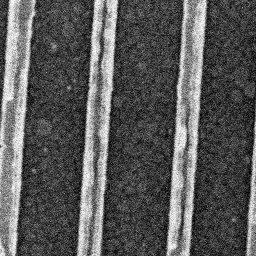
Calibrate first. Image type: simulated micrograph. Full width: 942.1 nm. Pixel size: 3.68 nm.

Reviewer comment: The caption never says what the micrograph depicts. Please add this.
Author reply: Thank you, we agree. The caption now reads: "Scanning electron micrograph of one or a few lines or trenches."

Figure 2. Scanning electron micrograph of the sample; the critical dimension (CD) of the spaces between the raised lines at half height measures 237 nm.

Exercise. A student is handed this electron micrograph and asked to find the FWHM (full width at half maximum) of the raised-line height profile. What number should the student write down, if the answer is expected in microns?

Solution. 0.0738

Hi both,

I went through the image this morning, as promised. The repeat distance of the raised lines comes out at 0.323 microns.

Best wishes